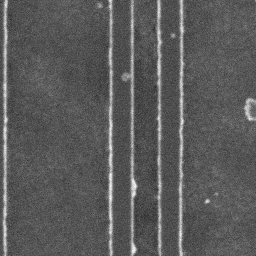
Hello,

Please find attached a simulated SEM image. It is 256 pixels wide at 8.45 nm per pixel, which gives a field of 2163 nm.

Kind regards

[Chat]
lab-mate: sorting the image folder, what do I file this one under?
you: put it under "lines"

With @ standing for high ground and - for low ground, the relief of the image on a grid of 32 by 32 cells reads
@-------------@@@---@@@---------
@-------------@@@---@@@---------
@-------------@@@---@@@---------
@-------------@@@---@@@---------
@-------------@@@---@@@---------
@-------------@@@---@@@---------
@-------------@@@---@@@---------
@-------------@@@---@@@---------
@-------------@@@---@@@---------
@-------------@@@---@@@---------
@-------------@@@---@@@---------
@-------------@@@---@@@---------
@-------------@@@---@@@---------
@-------------@@@---@@@---------
@-------------@@@---@@@---------
@-------------@@@---@@@---------
@-------------@@@---@@@---------
@-------------@@@---@@@---------
@-------------@@@---@@@---------
@-------------@@@---@@@---------
@-------------@@@---@@@---------
@-------------@@@---@@@---------
@-------------@@@---@@@---------
@-------------@@@---@@@---------
@-------------@@@---@@@---------
@-------------@@@---@@@---------
@-------------@@@---@@@---------
@-------------@@@---@@@---------
@-------------@@@---@@@---------
@-------------@@@---@@@---------
@-------------@@@---@@@---------
@-------------@@@---@@@---------